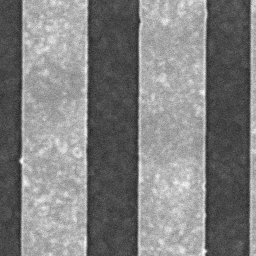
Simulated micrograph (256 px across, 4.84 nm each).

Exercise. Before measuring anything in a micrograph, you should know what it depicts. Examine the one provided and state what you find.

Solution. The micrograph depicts one or a few lines or trenches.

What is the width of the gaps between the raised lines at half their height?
239 nanometres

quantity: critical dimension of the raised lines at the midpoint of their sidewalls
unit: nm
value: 312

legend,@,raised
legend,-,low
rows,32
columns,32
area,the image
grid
---@@@@@@@@-------@@@@@@@@-----@
---@@@@@@@@------@@@@@@@@@-----@
---@@@@@@@@-------@@@@@@@@-----@
---@@@@@@@@-------@@@@@@@@-----@
---@@@@@@@@------@@@@@@@@@-----@
---@@@@@@@@------@@@@@@@@@-----@
---@@@@@@@@------@@@@@@@@@-----@
---@@@@@@@@-------@@@@@@@@-----@
---@@@@@@@@-------@@@@@@@@-----@
---@@@@@@@@-------@@@@@@@@-----@
---@@@@@@@@-------@@@@@@@@-----@
---@@@@@@@@-------@@@@@@@@-----@
---@@@@@@@@-------@@@@@@@@-----@
---@@@@@@@@------@@@@@@@@@-----@
---@@@@@@@@------@@@@@@@@@-----@
---@@@@@@@@------@@@@@@@@@-----@
---@@@@@@@@-------@@@@@@@@-----@
---@@@@@@@@------@@@@@@@@@-----@
---@@@@@@@@------@@@@@@@@@-----@
---@@@@@@@@------@@@@@@@@@-----@
---@@@@@@@@------@@@@@@@@@-----@
---@@@@@@@@------@@@@@@@@@-----@
---@@@@@@@@------@@@@@@@@@-----@
---@@@@@@@@------@@@@@@@@@-----@
---@@@@@@@@------@@@@@@@@@-----@
---@@@@@@@@------@@@@@@@@@-----@
---@@@@@@@@------@@@@@@@@@-----@
---@@@@@@@@------@@@@@@@@@-----@
---@@@@@@@@------@@@@@@@@@-----@
---@@@@@@@@------@@@@@@@@------@
---@@@@@@@@------@@@@@@@@------@
---@@@@@@@@------@@@@@@@@------@